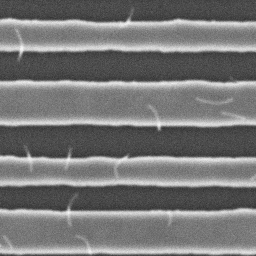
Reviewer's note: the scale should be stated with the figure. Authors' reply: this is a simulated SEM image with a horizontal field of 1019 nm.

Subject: lines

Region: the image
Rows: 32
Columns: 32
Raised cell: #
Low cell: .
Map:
................................
................................
##....................#.........
################################
################################
################################
................................
................................
................................
................................
################################
################################
################################
################################
################################
########.....#################.#
................................
................................
................................
................................
################################
################################
################################
................................
................................
................................
################################
################################
################################
################################
################################
################################